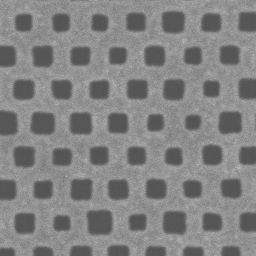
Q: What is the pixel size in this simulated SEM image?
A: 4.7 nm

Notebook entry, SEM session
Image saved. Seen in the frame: a regular array of holes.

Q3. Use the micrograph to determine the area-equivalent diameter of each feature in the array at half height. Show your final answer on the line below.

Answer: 0.0916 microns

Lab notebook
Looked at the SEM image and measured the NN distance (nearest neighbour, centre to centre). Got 174 nm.